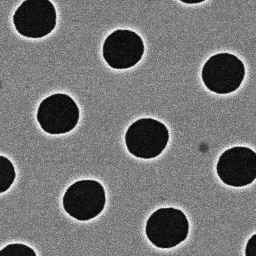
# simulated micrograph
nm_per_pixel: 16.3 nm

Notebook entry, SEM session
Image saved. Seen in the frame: holes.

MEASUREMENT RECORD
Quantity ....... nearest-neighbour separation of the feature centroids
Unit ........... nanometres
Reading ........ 1440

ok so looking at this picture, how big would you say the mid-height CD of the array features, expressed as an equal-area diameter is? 42.1 pixels